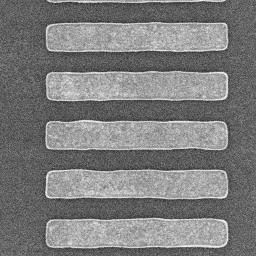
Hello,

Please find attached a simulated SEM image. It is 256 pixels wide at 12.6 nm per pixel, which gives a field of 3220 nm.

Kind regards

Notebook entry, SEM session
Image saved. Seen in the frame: groups of lines, slits or small figures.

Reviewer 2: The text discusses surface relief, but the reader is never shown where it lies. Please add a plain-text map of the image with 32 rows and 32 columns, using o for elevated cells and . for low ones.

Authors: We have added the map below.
................................
................................
................................
......oooooooooooooooooooooo....
......oooooooooooooooooooooo....
......oooooooooooooooooooooo....
................................
................................
................................
......oooooooooooooooooooooo....
......oooooooooooooooooooooo....
......oooooooooooooooooooooo....
........oo......................
................................
................................
......oooooooooooooooooooooo....
......oooooooooooooooooooooo....
......oooooooooooooooooooooo....
......oooooooooooooooo...ooo....
................................
................................
......ooooooo.oooooooooooooo....
......oooooooooooooooooooooo....
......oooooooooooooooooooooo....
......oooooooooooooooooooooo....
................................
................................
...............oooooo..oooo.....
......oooooooooooooooooooooo....
......oooooooooooooooooooooo....
......oooooooooooooooooooooo....
................................